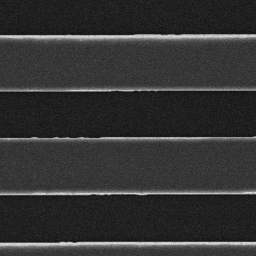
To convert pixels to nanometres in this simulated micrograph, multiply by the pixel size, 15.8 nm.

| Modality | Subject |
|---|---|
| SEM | lines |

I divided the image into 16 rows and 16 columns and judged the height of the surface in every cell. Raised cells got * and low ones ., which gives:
................
................
****************
****************
****************
****************
................
................
................
****************
****************
****************
................
................
................
****************